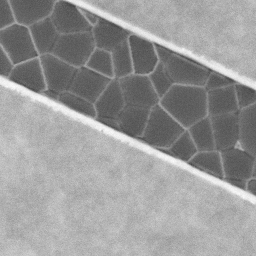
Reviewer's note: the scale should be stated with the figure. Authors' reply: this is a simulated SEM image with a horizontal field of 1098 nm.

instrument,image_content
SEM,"one or a few lines or trenches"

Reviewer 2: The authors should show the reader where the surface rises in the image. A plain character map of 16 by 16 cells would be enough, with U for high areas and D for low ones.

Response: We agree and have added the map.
DDDDDDUUUUUUUUUU
DDDDDDDDUUUUUUUU
DDDDDDDDDDUUUUUU
DDDDDDDDDDDDUUUU
DDDDDDDDDDDDDDUU
UDDDDDDDDDDDDDDD
UUUDDDDDDDDDDDDD
UUUUUDDDDDDDDDDD
UUUUUUUUDDDDDDDD
UUUUUUUUUUDDDDDD
UUUUUUUUUUUUDDDD
UUUUUUUUUUUUUUDD
UUUUUUUUUUUUUUUU
UUUUUUUUUUUUUUUU
UUUUUUUUUUUUUUUU
UUUUUUUUUUUUUUUU